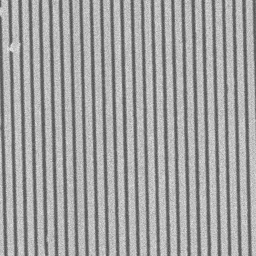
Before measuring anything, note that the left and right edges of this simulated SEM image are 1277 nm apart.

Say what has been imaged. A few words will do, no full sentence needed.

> parallel lines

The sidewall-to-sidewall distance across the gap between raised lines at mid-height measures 16.8 nanometers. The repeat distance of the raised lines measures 0.0507 um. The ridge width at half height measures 33.7 nanometers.